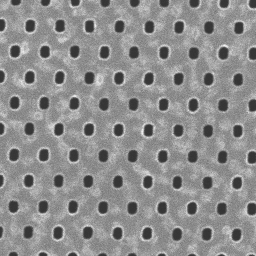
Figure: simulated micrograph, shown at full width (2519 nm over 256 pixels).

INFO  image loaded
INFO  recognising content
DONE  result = a regular array of holes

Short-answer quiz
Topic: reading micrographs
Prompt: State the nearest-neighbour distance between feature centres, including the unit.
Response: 291 nm